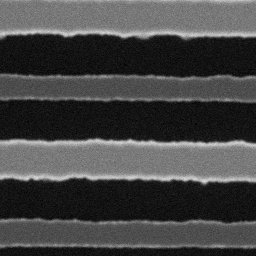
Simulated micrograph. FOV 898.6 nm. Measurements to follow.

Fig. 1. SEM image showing lines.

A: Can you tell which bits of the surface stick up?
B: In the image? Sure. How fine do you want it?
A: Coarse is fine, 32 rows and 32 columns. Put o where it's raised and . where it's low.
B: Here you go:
oooooooooooooooooooooooooooooooo
oooooooooooooooooooooooooooooooo
oooooooooooooooooooooooooooooooo
oooooooooooooooooooooooooooooooo
........o......oo.....oooooooooo
................................
................................
................................
................................
oooo..oo..oooooooooo.......oo...
oooooooooooooooooooooooooooooooo
oooooooooooooooooooooooooooooooo
............oo....o.oooo.ooooooo
................................
................................
................................
................................
................................
oooooooooooooooooooooooooooooooo
oooooooooooooooooooooooooooooooo
oooooooooooooooooooooooooooooooo
oooooooooooooooooooooooooooooooo
....................o.o.oooooooo
................................
................................
................................
................................
..o.o...........................
oooooooooooooooooooooooooooooooo
oooooooooooooooooooooooooooooooo
oooooooooooooooooooooooooooooooo
................................